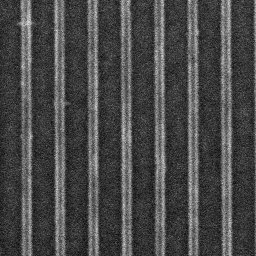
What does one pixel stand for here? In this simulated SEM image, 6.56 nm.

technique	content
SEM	parallel lines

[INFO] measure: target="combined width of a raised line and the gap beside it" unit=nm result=218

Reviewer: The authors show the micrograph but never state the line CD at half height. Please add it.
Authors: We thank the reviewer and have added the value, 46.7 nm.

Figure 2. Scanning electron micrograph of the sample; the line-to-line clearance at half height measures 169 nanometres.